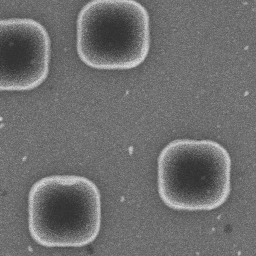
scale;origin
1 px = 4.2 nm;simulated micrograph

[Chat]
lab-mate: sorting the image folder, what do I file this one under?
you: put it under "raised bodies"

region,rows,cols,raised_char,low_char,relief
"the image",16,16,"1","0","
0000011110000000
1100011110000000
1110011110000000
1110011110000000
1110000000000000
1000000000000000
0000000000000000
0000000000000000
0000000000000000
0000000000111100
0000000000111100
0011110000111100
0011110000111100
0011110000000000
0011110000000000
0000000000000000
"